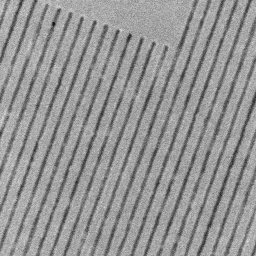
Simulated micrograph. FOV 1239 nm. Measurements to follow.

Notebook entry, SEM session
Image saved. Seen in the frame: parallel lines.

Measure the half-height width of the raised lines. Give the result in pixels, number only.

8.6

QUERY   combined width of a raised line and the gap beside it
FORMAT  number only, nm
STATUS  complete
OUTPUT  61.2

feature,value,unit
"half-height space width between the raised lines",20.5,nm